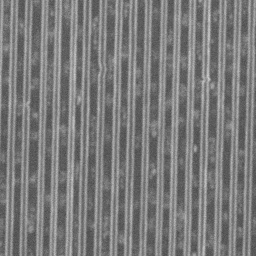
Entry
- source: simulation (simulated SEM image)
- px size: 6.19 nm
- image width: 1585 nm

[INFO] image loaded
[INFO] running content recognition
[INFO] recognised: parallel lines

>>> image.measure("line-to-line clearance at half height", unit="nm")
58.8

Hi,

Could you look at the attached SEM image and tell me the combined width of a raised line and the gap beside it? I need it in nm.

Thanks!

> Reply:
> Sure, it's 91.9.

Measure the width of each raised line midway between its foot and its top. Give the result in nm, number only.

34.8